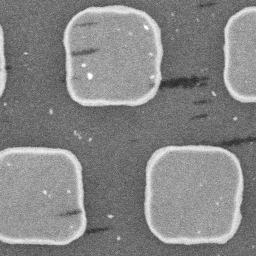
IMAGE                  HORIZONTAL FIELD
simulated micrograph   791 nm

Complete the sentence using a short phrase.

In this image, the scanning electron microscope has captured raised bodies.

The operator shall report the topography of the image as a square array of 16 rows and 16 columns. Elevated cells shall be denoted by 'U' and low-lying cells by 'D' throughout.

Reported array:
DDDDDDDDDDDDDDDD
DDDDUUUUUUDDDDUU
DDDDUUUUUUDDDDUU
DDDDUUUUUUDDDDUU
DDDDUUUUUUDDDDUU
DDDDUUUUUUDDDDUU
DDDDDUUUDDDDDDDD
DDDDDDDDDDDDDDDD
DDDDDDDDDDDDDDDD
UUUUDDDDDDUUUUDD
UUUUUDDDDUUUUUUD
UUUUUDDDDUUUUUUD
UUUUUDDDDUUUUUUD
UUUUUDDDDUUUUUUD
UUUUUDDDDDUUUUUD
DDDDDDDDDDDDDDDD